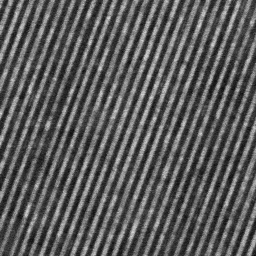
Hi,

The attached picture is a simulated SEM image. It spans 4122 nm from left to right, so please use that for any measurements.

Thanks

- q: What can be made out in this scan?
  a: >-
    parallel lines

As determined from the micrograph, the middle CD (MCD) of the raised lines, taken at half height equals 56.6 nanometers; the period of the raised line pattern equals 157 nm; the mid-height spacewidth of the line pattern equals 100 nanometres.